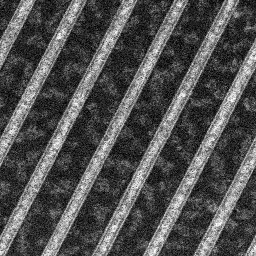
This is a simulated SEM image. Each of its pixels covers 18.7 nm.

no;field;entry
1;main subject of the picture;parallel lines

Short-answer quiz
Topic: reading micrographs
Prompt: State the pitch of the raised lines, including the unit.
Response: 834 nanometres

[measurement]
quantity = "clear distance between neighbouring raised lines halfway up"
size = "214 nm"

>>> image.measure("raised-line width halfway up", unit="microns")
0.642